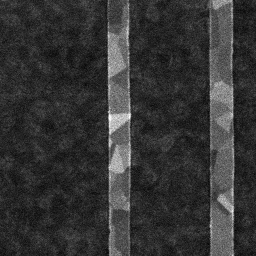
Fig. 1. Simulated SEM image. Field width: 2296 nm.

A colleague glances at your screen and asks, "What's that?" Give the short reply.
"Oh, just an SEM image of one or a few lines or trenches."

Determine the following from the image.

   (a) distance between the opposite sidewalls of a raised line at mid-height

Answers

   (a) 194 nanometres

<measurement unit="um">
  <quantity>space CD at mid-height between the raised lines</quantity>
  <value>0.728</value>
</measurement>